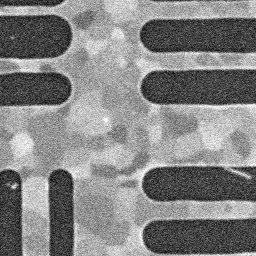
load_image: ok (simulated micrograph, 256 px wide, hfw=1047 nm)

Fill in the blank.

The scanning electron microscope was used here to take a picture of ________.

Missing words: groups of lines, slits or small figures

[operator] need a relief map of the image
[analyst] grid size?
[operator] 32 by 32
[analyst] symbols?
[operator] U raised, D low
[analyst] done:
DDDDDDDDUUUUUUUUUUUUUUUUUUUUUUUU
UUUUUUUUUUUUUUUUUUUUUUUUUUUUUUUU
DDDDDDDDUUUUUUUUUUUDDDDDDDDDDDDD
DDDDDDDDDUUUUUUUUUDDDDDDDDDDDDDD
DDDDDDDDDUUUUUUUUDDDDDDDDDDDDDDD
DDDDDDDDDUUUUUUUUUDDDDDDDDDDDDDD
DDDDDDDDUUUUUUUUUUUDDDDDDDDDDDDD
UUUUUUUUUUUUUUUUUUUUUUUUUUUUUUUU
UUUUUUUUUUUUUUUUUUUUUUUUUUUDDDDU
DDDDDDDDUUUUUUUUUUDDDDDDDDDDDDDD
DDDDDDDDDUUUUUUUUDDDDDDDDDDDDDDD
DDDDDDDDDUUUUUUUUDDDDDDDDDDDDDDD
DDDDDDDDDUUUUUUUUUDDDDDDDDDDDDDD
UUUUUUUUUUUUUUUUUUUUUUUUUUUUUUUU
UUUUUUUUUUUUUUUUUUUUUUUUUUUUUUUU
UUUUUUUUUUUUUUUUUUUUUUUUUUUUUUUU
UUUUUUUUUUUUUUUUUUUUUUUUUUUUUUUU
UUUUUUUUUUUUUUUUUUUUUUUUUUUUUUUU
UUUUUUUUUUUUUUUUUUUUUUUUUUUUUUUU
UUUUUUUUUUUUUUUUUUUUUUUUUUUUUUUU
UUUUUUUUUUUUUUUUUUUUUUUUUUUUUUUU
DDUUUUDDDUUUUUUUUUDDDDDDDDDDDDDD
DDDUUUDDDUUUUUUUUUDDDDDDDDDDDDDD
DDDUUUDDDUUUUUUUUUDDDDDDDDDDDDDD
DDDUUUDDDUUUUUUUUUDDDDDDDDDDDDDD
DDDUUUDDDUUUUUUUUUUUUUUUUUUUUUUU
DDDUUUDDDUUUUUUUUUUUUUUUUUUUUUUU
DDDUUUDDDUUUUUUUUUUDDDDDDDDDDDDD
DDDUUUDDDUUUUUUUUUDDDDDDDDDDDDDD
DDDUUUDDDUUUUUUUUUDDDDDDDDDDDDDD
DDDUUUDDDUUUUUUUUUDDDDDDDDDDDDDD
DDDUUUDDDUUUUUUUUUUDDDDDDDDDDDDD